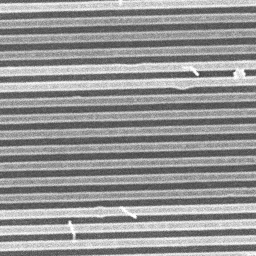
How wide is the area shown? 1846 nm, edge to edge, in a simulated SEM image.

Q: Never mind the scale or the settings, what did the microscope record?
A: parallel lines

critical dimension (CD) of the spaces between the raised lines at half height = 57.6 nm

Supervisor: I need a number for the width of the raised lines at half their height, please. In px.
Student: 7.99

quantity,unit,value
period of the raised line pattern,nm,114